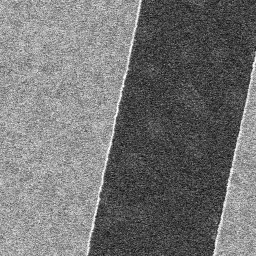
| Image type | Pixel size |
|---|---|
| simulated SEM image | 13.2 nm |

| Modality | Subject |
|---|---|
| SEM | one or a few lines or trenches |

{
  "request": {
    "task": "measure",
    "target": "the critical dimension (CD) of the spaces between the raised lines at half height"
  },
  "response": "1640 nanometers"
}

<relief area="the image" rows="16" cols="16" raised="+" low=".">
+++++++++.......
+++++++++.......
++++++++........
++++++++........
++++++++........
++++++++........
+++++++........+
+++++++........+
+++++++........+
+++++++........+
+++++++.......++
++++++........++
++++++........++
++++++........++
++++++........++
++++++.......+++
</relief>